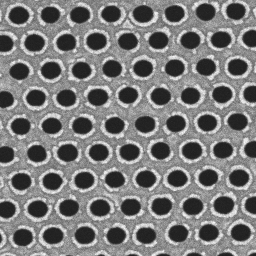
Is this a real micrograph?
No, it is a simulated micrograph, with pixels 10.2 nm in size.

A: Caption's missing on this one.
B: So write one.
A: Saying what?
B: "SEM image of a regular array of holes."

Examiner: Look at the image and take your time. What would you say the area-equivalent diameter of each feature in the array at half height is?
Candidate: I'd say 186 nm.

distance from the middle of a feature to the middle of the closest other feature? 313 nm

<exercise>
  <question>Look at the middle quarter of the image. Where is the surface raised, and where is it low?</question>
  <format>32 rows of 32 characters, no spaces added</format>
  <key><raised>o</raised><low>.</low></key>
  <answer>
oo....oooo....ooo.....ooo.....oo
oo.....ooo.....oo.....ooo.....oo
oo.....ooo....oooo....oooo...ooo
ooo..ooooooooooooooooooooooooooo
oooooooooooooooooooooooooooooooo
oooooooooooooooooooooooooooooooo
.oooooo...oooo....oooo....oooo..
...ooo.....ooo....oooo.....oo...
...ooo.....ooo....oooo.....oo...
...ooo.....oooo..ooooo....oooo..
.ooooooo.ooooooooooooooooooooooo
oooooooooooooooooooooooooooooooo
oooooooooooooooooooooooooooooooo
oooo..oooooo..ooooo...oooo....oo
oo.....oooo....ooo.....oo.....oo
oo.....ooo.....ooo.....ooo....oo
oo.....oooo....ooo....oooo....oo
oooo.ooooooooooooooooooooooooooo
oooooooooooooooooooooooooooooooo
oooooooooooooooooooooooooooooooo
...oooo...ooooo...oooo....oooo..
...ooo.....ooo.....ooo....oooo..
....oo.....ooo.....ooo....oooo..
...oooo....ooo....ooooo...ooooo.
.ooooooooooooooooooooooooooooooo
oooooooooooooooooooooooooooooooo
oooooooooooooooooooooooooooo.ooo
ooo....oooo....oooo....ooo....oo
ooo....ooo.....ooo.....ooo.....o
ooo....ooo.....ooo.....ooo.....o
ooo....oooo...ooooo...ooooo..ooo
oooooooooooooooooooooooooooooooo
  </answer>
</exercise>